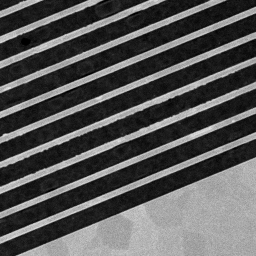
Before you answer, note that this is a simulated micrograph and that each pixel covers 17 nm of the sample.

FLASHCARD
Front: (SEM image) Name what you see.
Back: parallel lines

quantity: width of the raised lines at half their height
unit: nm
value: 86.6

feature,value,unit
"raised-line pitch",395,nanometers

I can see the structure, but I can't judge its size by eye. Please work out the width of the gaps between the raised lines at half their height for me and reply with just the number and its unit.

307 nm